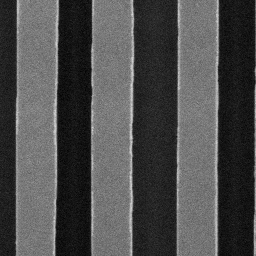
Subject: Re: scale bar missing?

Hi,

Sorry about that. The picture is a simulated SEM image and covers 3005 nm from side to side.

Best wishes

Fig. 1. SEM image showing lines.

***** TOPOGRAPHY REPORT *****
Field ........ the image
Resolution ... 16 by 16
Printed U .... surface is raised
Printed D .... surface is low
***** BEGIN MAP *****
DUUUDDUUDDDUUUDD
DUUUDDUUDDDUUUDD
DUUUDDUUDDDUUUDD
DUUUDDUUDDDUUUDD
DUUUDDUUDDDUUUDD
DUUUDDUUDDDUUUDD
DUUUDDUUDDDUUUDD
DUUUDDUUDDDUUUDD
DUUUDDUUDDDUUUDD
DUUUDDUUDDDUUUDD
DUUUDDUUDDDUUUDD
DUUUDDUUDDDUUUDD
DUUUDDUUDDDUUUDD
DUUDDDUUDDDUUUDD
DUUDDDUUDDDUUUDD
DUUDDDUUDDDUUUDD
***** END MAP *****